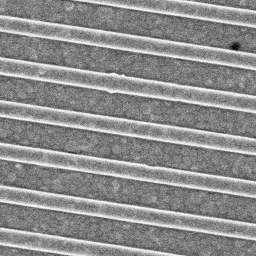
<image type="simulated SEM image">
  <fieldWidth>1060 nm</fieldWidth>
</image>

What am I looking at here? parallel lines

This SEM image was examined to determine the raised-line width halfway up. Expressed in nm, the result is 64.6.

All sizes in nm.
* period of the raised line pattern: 175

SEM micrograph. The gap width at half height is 108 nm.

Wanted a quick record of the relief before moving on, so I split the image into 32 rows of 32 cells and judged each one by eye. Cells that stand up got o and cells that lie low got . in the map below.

............oooooooooooooo......
...................ooooooooooooo
oooo......................oooooo
oooooooooo......................
....ooooooooooooo...............
...........ooooooooooooo........
.................ooooooooooooo..
oo......................oooooooo
ooooooooo......................o
..oooooooooooooo................
........ooooooooooooo...........
..............oooooooooooooo....
......................oooooooooo
oooooo......................oooo
ooooooooooooo...................
.......ooooooooooooo............
.............ooooooooooooo......
...................ooooooooooooo
oooo......................oooooo
ooooooooooo.....................
....ooooooooooooo...............
...........ooooooooooooo........
..................ooooooooooooo.
oo......................oooooooo
oooooooo.......................o
..ooooooooooooo.................
.........ooooooooooooo..........
...............ooooooooooooo....
......................oooooooooo
ooooooo.....................oooo
ooooooooooooo...................
......oooooooooooooo............